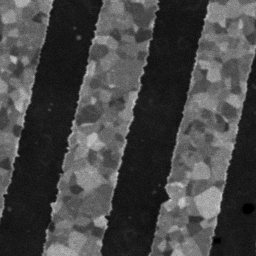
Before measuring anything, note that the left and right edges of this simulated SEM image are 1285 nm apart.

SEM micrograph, one or a few lines or trenches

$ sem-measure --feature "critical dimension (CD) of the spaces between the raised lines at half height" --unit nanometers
247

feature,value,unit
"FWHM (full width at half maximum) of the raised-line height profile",278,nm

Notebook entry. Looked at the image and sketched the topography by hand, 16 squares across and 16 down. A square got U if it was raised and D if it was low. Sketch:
UUUDDDUUUUDDDUUU
UUUDDDUUUUDDDUUU
UUUDDDUUUDDDDUUU
UUDDDDUUUDDDUUUU
UUDDDUUUUDDDUUUU
UUDDDUUUUDDDUUUD
UUDDDUUUDDDDUUUD
UUDDDUUUDDDUUUUD
UDDDUUUUDDDUUUUD
UDDDUUUUDDDUUUUD
UDDDUUUDDDDUUUDD
UDDDUUUDDDUUUUDD
DDDUUUUDDDUUUUDD
DDDUUUUDDDUUUUDD
DDDUUUUDDDUUUDDD
DDDUUUDDDUUUUDDD